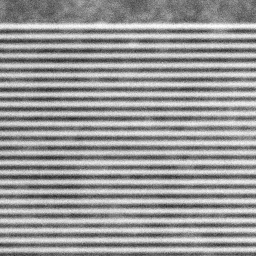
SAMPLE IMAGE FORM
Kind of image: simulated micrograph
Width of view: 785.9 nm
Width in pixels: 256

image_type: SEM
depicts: parallel lines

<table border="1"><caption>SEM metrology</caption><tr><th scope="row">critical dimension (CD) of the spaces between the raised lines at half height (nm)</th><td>17.3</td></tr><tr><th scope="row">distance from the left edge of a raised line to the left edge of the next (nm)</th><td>29.8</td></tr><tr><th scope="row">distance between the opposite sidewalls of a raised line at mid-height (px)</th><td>3.75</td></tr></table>